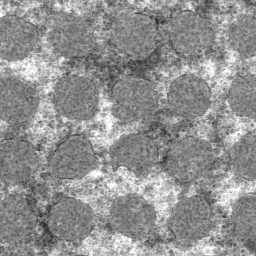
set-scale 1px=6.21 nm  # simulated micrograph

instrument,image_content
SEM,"a regular array of raised bodies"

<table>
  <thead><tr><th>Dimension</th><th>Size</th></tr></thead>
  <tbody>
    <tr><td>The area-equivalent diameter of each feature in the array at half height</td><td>251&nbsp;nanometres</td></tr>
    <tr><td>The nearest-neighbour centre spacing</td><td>358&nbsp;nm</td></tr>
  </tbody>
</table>